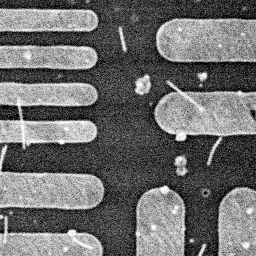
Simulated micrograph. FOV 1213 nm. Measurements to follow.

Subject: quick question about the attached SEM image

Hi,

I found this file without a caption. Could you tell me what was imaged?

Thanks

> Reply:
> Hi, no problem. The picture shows groups of lines, slits or small figures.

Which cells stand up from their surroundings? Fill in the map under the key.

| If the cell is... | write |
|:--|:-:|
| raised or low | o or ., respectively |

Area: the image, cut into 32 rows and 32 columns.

................................
ooooooooooo.....................
oooooooooooo....................
oooooooooo.o........oooooooooooo
.....................ooooooooooo
....................oooooooooooo
oooooooooooo........oooooooooooo
oooooooooooo.........ooooooooooo
.......ooo......................
................................
ooo..............oo.............
oooooooooooo.....o....o.........
oooooooooooo.........ooooooooooo
.....................oooooooooo.
...................oooooooooooo.
oooooooooooo........oooooooooooo
oooooooooooo.........ooooooooooo
ooooooooooo.....................
................................
................................
......................o.........
......................o.........
ooooo.oooooo....................
ooooooooooooo.......o...........
ooooooooo.ooo.....oooo......o.oo
ooooooooo.oo.....oooooo.....oooo
.................oooooo....ooooo
.................oooooo....ooooo
.................oooooo....ooooo
oooooooooooo.....oooooo....ooooo
ooooooooooooo....oooooo....ooooo
ooooooooooooo....oooooo....ooooo